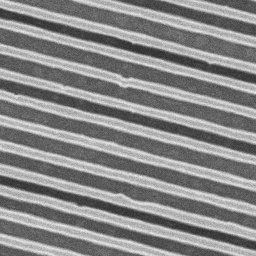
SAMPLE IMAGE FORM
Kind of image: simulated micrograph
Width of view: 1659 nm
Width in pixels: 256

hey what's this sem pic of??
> parallel lines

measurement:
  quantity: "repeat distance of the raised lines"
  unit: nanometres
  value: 148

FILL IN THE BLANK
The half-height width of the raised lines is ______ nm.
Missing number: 62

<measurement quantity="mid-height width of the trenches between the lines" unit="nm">93.3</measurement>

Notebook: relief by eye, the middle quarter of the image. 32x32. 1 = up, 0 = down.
11111100000000000000011111111100
11111111110000000000000011111111
00001111111110000000000000001111
00000000111111100000000000000000
00000000000011111111100000000000
00000000000000111111111110000000
11110000000000000000111111111000
11111111000000000000000011111111
00001111111110000000000000011111
00000001111111110000000000000000
00000000000111111110000000000000
11110000000000001111111000000000
11111110000000000001111111110000
01111111111110000000000011111111
00000011111111110000000000011111
00000000001111111111000000000011
00000000000000011111111000000000
11100000000000000011111111100000
11111110000000000000001111111110
01111111111000000000000000111111
00000111111111100000000000000111
00000000011111111100000000000000
00000000000011111111110000000000
10000000000000001111111100000000
11111000000000000001111111111000
11111111100000000000000011111111
00011111111110000000000000001111
00000001111111111100000000000001
00000000000011111111110000000000
10000000000000001111111100000000
11111000000000000000111111110000
11111111100000000000000011111111